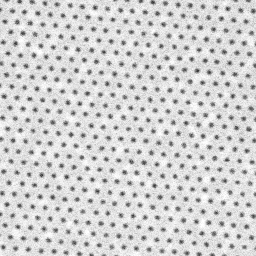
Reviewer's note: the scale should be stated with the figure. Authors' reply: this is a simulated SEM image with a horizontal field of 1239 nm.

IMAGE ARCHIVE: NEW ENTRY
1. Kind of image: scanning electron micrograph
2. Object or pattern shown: a regular array of holes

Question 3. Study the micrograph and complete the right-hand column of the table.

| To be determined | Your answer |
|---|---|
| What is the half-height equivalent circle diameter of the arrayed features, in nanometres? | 26.7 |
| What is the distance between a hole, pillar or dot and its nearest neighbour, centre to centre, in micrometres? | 0.0577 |